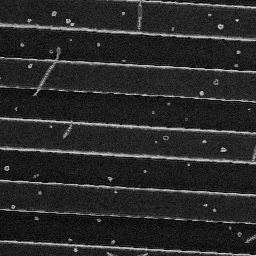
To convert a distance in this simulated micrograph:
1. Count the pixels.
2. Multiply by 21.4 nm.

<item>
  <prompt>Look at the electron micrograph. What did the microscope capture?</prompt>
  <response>lines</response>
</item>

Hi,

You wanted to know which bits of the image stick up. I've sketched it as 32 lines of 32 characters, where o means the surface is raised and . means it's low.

oooooooooooooooooooooooo........
oooooooooooooooooooooooooooooooo
oooooooooooooooooooooooooooooooo
.......ooooooooooooooooooooooooo
......................oooooooooo
................................
................................
ooooo...........................
oooooooooooooooooooooooo........
oooooooooooooooooooooooooooooooo
oooooooooooooooooooooooooooooooo
...........ooooooooooooooooooooo
...........................ooooo
................................
................................
oooooooooooo....................
ooooooooooooooooooooooooooooo...
oooooooooooooooooooooooooooooooo
oooooooooooooooooooooooooooooooo
..................oooooooooooooo
................................
................................
................................
oooooooooooooooo................
oooooooooooooooooooooooooooooooo
oooooooooooooooooooooooooooooooo
......oooooooooooooooooooooooooo
........................oooooooo
................................
................................
oooooo..........................
oooooooooooooooooooooooo........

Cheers